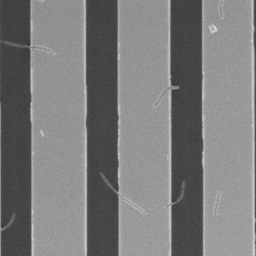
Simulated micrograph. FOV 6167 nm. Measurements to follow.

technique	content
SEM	lines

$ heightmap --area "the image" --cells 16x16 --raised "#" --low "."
..###..####..###
..###..####..###
..###..####..###
..###..####..###
..###..####..###
..###..####..###
..###..####..###
..###..####..###
..###..####..###
..###..####..###
..###..####..###
..###..####..###
..###..####..###
..###..####..###
..###..####..###
..###..####..###